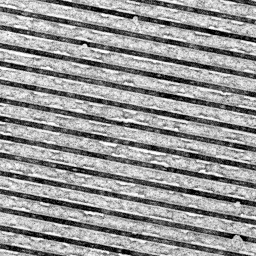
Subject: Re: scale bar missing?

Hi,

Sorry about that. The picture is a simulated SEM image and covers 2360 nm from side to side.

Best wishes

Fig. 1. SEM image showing parallel lines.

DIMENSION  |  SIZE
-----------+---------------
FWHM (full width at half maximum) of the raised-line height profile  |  113 nm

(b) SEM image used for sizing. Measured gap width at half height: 0.0554 µm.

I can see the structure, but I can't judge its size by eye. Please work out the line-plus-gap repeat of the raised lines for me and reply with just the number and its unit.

165 nm